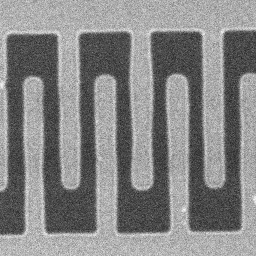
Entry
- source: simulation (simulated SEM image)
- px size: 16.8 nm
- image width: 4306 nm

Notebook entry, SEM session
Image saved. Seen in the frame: groups of lines, slits or small figures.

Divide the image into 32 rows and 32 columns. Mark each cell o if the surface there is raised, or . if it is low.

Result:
................................
................................
................................
................................
.oooooo...ooooooo..oooooo...oooo
.ooooooo..ooooooo..oooooo...oooo
.ooooooo..ooooooo..oooooo...oooo
.ooooooo..ooooooo..ooooooo..oooo
.ooooooo..oooooo...ooooooo..oooo
.ooooooo..oooooo...ooooooo..ooo.
ooo..ooo..oo..oo...oo..ooo..oo..
.oo..ooo..oo..oo...oo..ooo..oo..
.oo..ooo..oo..ooo..oo..ooo..oo..
.oo..ooo..oo..ooo..oo..ooo..oo..
.oo..ooo..oo..ooo..oo..ooo..oo..
.oo..ooo..oo..ooo..oo..ooo..oo..
.oo..ooo..oo..ooo..oo..ooo..oo..
.oo..ooo..oo..ooo..oo..ooo..oo..
.oo..ooo..oo..ooo..oo..ooo..oo..
.oo..ooo..oo..ooo..oo..ooo..oo..
.oo..ooo..oo..ooo..oo..ooo..oo..
.oo..ooo..oo..ooo..oo..ooo..oo..
.oo..ooo..oo..ooo..oo..ooo..oo..
ooo..ooooooo..ooooooo..ooooooo..
ooo..ooooooo..ooooooo..ooooooo..
ooo..ooooooo..ooooooo..ooooooo..
ooo..ooooooo..oooooooo.ooooooo..
ooo..ooooooo..oooooooo.ooooooo..
ooo..ooooooo..oooooooo.ooooooo..
ooo.............................
................................
................................